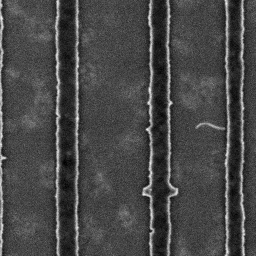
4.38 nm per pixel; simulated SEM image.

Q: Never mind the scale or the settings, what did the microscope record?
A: one or a few lines or trenches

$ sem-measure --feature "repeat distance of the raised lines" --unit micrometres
0.366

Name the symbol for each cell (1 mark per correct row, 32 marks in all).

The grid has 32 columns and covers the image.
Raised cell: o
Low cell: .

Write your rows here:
.......ooo.........oo.......oo..
.......ooo.........oo.......oo..
.......ooo.........oo.......oo..
.......ooo.........oo.......oo..
.......ooo.........oo.......oo..
.......ooo.........oo.......oo..
.......ooo.........oo.......oo..
.......ooo.........oo.......oo..
.......ooo.........oo.......oo..
.......ooo.........oo.......oo..
.......ooo.........oo.......oo..
.......ooo.........oo.......oo..
.......ooo.........oo.......oo..
.......ooo.........oo.......oo..
.......ooo.........oo.......oo..
.......ooo.........oo.......oo..
.......ooo.........oo.......oo..
.......ooo.........oo.......oo..
.......ooo.........oo.......oo..
.......ooo.........oo.......oo..
.......ooo.........oo.......oo..
.......ooo.........oo.......oo..
.......ooo.........oo.......oo..
.......ooo........oooo......oo..
.......ooo........oooo......oo..
.......ooo.........oo.......oo..
.......ooo.........oo.......oo..
.......ooo.........oo.......oo..
.......ooo.........oo.......oo..
.......ooo.........oo.......oo..
.......ooo.........oo.......oo..
.......ooo.........oo.......oo..